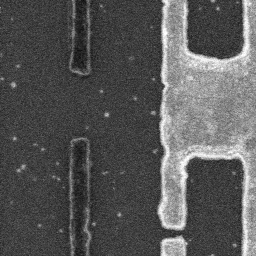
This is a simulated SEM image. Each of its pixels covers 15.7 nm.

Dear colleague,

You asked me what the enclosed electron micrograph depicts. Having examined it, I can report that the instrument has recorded one or a few lines or trenches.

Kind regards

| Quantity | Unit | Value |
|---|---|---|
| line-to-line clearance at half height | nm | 1170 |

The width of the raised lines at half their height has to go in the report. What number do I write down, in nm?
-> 280